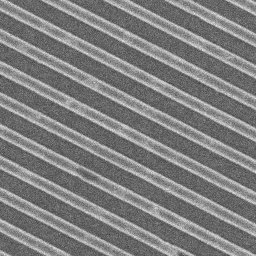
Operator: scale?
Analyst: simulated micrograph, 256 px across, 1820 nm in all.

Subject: parallel lines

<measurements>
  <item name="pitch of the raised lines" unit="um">0.2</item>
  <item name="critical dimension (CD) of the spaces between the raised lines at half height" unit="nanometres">121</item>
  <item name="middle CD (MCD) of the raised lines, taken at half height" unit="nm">76.4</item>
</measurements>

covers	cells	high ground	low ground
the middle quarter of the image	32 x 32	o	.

oo.........oooooo..........ooooo
oooo.........oooooo..........ooo
oooooo.........oooooo..........o
..ooooo..........oooooo.........
....ooooo..........oooooo.......
......ooooo..........oooooo.....
........ooooo..........oooooo...
..........ooooo..........oooooo.
oo..........ooooo..........ooooo
oooo..........ooooo..........ooo
oooooo..........ooooo..........o
..ooooo..........oooooo.........
....ooooo..........oooooo.......
......ooooo..........oooooo.....
........oooooo.........oooooo...
..........oooooo.........oooooo.
oo..........oooooo.........ooooo
oooo..........oooooo.........ooo
oooooo.........ooooooo.........o
..oooooo.........ooooooo........
....oooooo.........oooooo.......
......oooooo.........oooooo.....
........oooooo.........oooooo...
o.........oooooo.........oooooo.
oo..........oooooo.........ooooo
oooo.........ooooooo.........ooo
oooooo.........ooooooo.........o
..oooooo..........ooooo.........
....oooooo..........ooooo.......
......oooooo..........ooooo.....
........oooooo..........ooooo...
o.........oooooo..........ooooo.